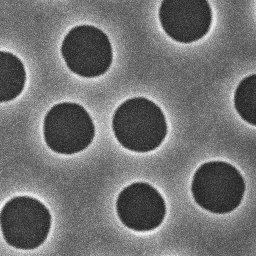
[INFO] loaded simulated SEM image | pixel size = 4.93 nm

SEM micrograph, holes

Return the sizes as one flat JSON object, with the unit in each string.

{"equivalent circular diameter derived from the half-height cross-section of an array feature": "0.264 micrometres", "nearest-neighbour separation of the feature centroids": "79.4 px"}